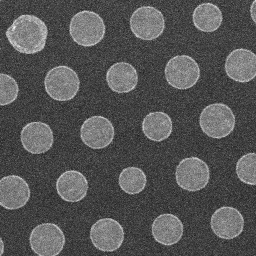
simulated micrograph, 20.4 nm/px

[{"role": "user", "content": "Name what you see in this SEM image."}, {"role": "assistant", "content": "a regular array of raised bodies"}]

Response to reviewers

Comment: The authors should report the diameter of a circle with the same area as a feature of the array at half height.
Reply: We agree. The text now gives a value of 665 nanometres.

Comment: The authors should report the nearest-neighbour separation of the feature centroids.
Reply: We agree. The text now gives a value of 1220 nanometres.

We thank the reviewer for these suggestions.